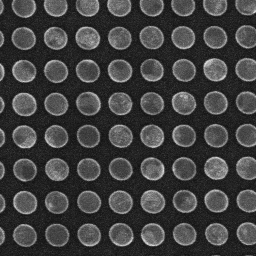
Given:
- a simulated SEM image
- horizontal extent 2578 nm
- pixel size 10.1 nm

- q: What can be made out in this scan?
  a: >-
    a regular array of raised bodies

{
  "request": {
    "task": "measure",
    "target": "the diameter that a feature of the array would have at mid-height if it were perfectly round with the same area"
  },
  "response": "227 nm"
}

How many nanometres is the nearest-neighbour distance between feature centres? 321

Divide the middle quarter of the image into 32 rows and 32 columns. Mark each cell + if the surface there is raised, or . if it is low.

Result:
...+++++...+++++...+++++...+++++
+..++++++..++++++..++++++..+++++
+..++++++..++++++...+++++...++++
....++++....++++....++++....++++
................................
................................
................................
.....++......+++....+++.....+++.
....+++++...++++....++++...+++++
+..++++++..++++++..++++++..+++++
+..++++++..++++++..++++++..+++++
+...+++++...+++++...+++++...++++
.....++......++......++......++.
................................
................................
.............++......++......++.
....++++....++++....++++....++++
+..++++++..++++++..++++++..+++++
+..++++++..++++++..++++++..+++++
+...+++++...+++++...+++++...++++
.....++......++......+++.....++.
................................
................................
................................
....++++....++++....++++....++++
+..++++++..++++++..++++++..+++++
+..++++++..++++++..++++++..+++++
+...+++++...+++++...+++++...++++
.....+++.....+++.....+++.....+++
................................
................................
................................